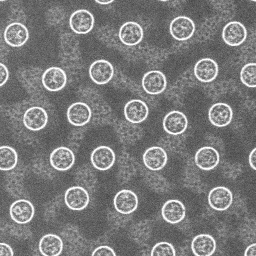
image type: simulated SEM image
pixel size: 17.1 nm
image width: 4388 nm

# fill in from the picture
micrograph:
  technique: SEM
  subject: a regular array of raised bodies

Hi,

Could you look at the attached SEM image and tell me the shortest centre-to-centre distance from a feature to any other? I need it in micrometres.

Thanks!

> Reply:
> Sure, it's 0.749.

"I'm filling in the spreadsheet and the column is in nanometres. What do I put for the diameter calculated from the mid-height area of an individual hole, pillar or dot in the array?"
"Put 373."